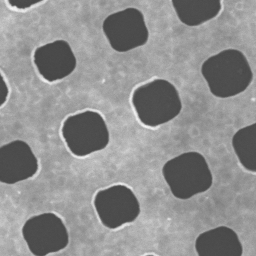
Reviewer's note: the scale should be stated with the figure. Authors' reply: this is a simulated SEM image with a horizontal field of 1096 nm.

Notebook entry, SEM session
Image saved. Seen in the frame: holes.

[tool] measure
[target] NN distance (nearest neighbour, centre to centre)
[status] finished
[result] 0.331 microns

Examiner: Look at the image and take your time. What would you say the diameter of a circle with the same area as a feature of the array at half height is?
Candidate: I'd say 191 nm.